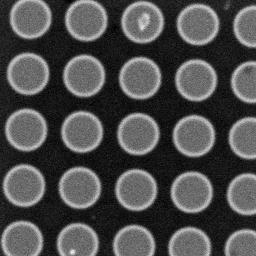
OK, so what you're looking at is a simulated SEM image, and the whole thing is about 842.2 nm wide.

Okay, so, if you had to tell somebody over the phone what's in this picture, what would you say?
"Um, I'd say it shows an array of small figures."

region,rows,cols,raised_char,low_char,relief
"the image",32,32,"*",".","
..****...***.....**.............
.*****..*****...****...****...**
.*****..*****..*****..*****..***
..****..*****..*****..*****..***
...**....***....****...****...**
........................*......*
................................
..***....***....***.............
.*****..*****..*****...***....**
.*****..*****..*****..*****..***
.*****..*****..*****..*****..***
..***....***....***....****..***
........................*.....**
................................
.****....***....**..............
.*****..*****..****...****...***
.*****..*****..*****..*****..***
.****...*****..*****..*****..***
..**.....***...****...****...***
........................*.....**
................................
.****...****....**..............
.****...****...****...****...***
*****..*****...****..*****...***
.****...****...****..*****..****
..**....****...****...****...***
..............................**
................................
.****...***.....**.....*........
*****..*****..*****...****...***
*****..*****..*****..*****..****
.****..*****..*****..*****..****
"